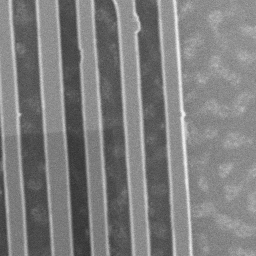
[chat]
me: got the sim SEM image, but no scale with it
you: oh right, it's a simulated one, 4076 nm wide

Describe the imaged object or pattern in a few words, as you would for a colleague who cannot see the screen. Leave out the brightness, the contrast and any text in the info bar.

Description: parallel lines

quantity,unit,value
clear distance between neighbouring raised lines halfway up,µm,0.385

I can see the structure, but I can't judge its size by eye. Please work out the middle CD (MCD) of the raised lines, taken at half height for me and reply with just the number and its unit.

17.5 px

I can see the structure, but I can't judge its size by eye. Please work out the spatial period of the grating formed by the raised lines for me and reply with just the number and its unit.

647 nm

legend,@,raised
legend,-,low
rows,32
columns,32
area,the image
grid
@----@@---@@--@@@---@@----------
@----@@---@@---@@---@@----------
@----@@---@@---@@---@@----------
@@---@@---@@---@@@--@@----------
@@---@@---@@---@@---@@----------
@@---@@---@@---@@---@@----------
@@---@@@--@@---@@---@@----------
@@---@@@--@@---@@---@@----------
@@---@@@--@@---@@---@@----------
@@---@@@--@@---@@---@@----------
@@---@@@--@@---@@---@@----------
@@---@@@--@@---@@----@@---------
@@---@@@--@@---@@@---@@---------
@@---@@@--@@---@@@---@@---------
@@---@@@--@@@---@@---@@---------
@@---@@@--@@@---@@---@@---------
@@----@@---@@---@@---@@---------
@@----@@---@@---@@---@@---------
@@----@@---@@---@@---@@---------
@@@---@@---@@---@@---@@---------
@@@---@@---@@---@@---@@---------
-@@---@@---@@---@@---@@---------
-@@---@@@--@@---@@---@@---------
-@@---@@@--@@---@@---@@---------
-@@---@@@--@@---@@---@@---------
-@@---@@@--@@---@@---@@@--------
-@@---@@@--@@---@@---@@@--------
-@@---@@@--@@---@@---@@@--------
-@@---@@@--@@----@@---@@--------
-@@---@@@--@@----@@---@@--------
-@@---@@@--@@----@@---@@--------
-@@----@@--@@----@@---@@--------